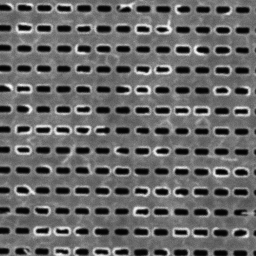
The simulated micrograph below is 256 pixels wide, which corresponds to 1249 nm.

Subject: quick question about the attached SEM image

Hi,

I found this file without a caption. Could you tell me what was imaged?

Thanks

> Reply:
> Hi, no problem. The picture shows a regular array of holes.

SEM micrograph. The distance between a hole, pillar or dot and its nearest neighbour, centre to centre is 95.2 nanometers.